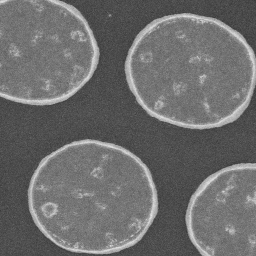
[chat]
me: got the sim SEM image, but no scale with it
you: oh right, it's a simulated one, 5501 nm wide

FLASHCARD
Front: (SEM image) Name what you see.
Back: raised bodies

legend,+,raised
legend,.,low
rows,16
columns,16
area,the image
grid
++++............
+++++.....++++..
++++++...++++++.
++++++..++++++++
++++++..++++++++
+++++...++++++++
.........++++++.
..........++++..
................
....++++........
..+++++++......+
..++++++++...+++
..++++++++..++++
..++++++++..++++
...++++++...++++
....++++....++++